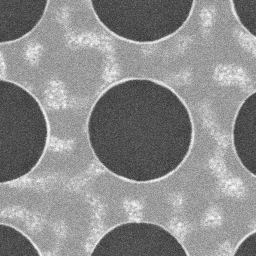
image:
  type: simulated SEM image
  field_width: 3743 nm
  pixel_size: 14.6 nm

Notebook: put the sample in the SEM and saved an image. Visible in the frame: holes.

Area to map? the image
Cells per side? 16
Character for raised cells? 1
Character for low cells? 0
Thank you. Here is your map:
0001110000001110
0011110000011110
0111111100111111
1111111111111111
1111111111111111
0111111000011111
0011110000001110
0001110000001110
0001110000001110
0001110000001110
0011111000011110
1111111111111111
1111111111111111
1111111111111111
0111111000011111
0011110000011110